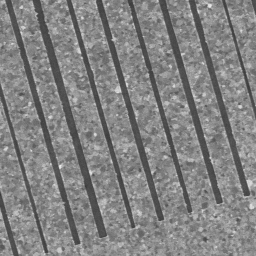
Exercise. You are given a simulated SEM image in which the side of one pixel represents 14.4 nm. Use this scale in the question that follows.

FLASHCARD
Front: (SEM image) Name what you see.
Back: parallel lines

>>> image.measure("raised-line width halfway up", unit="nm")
344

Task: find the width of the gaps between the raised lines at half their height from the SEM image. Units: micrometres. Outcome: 0.0907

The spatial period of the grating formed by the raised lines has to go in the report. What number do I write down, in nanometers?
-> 430